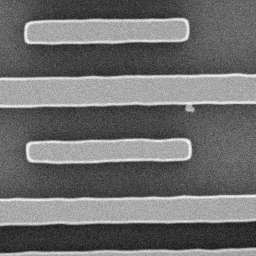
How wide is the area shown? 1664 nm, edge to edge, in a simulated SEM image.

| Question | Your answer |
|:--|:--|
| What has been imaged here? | groups of lines, slits or small figures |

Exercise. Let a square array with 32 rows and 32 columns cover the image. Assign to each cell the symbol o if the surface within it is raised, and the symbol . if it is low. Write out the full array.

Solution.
................................
................................
...........oo.....ooooo.........
...oooooooooooooooooooo.........
...oooooooooooooooooooo.........
................................
................................
................................
................................
............................ooo.
oooooooooooooooooooooooooooooooo
oooooooooooooooooooooooooooooooo
oooooooooooooooooooooooooooooooo
................................
................................
................................
................................
................ooo..oo.........
...ooooooooooooooooooooo........
...ooooooooooooooooooooo........
................................
................................
................................
................................
..............................oo
oooooooooooooooooooooooooooooooo
oooooooooooooooooooooooooooooooo
oooooooooooooooooooooooooooooooo
................................
................................
................................
............oooooooooooooooooooo